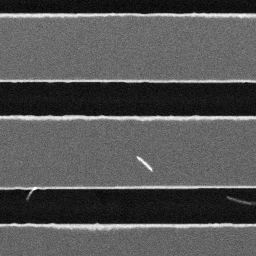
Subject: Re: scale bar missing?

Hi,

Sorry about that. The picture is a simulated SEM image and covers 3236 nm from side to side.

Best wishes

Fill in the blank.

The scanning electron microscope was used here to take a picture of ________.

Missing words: lines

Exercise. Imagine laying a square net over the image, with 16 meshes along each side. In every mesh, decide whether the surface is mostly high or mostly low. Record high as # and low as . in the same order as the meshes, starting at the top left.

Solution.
................
################
################
################
################
................
................
################
################
################
################
################
................
................
################
################